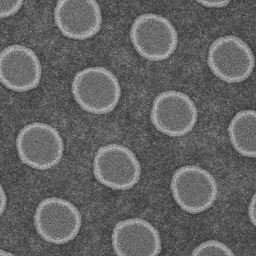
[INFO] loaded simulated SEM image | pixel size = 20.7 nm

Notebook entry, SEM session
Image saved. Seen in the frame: a regular array of raised bodies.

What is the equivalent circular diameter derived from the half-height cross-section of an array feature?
43 pixels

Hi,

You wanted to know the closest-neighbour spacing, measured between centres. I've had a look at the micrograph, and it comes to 1610 nanometers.